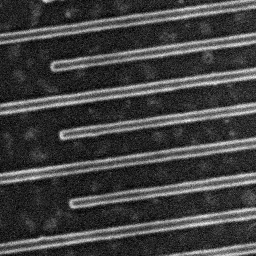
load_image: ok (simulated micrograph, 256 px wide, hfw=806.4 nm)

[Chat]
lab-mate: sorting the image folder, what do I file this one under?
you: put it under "parallel lines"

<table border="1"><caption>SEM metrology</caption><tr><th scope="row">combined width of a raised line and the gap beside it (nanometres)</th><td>109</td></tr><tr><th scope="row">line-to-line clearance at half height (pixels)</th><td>25.9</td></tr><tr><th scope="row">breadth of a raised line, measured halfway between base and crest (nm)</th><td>26.1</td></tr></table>